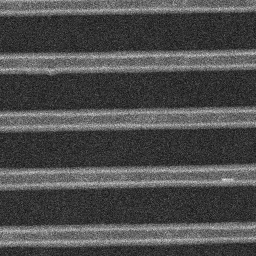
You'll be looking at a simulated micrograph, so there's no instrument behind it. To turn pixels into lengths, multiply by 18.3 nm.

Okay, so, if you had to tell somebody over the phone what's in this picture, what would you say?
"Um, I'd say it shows parallel lines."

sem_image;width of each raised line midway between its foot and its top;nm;282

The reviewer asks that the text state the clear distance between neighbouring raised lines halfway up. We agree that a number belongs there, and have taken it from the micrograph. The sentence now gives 0.761 microns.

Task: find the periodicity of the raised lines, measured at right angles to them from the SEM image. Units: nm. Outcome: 1060